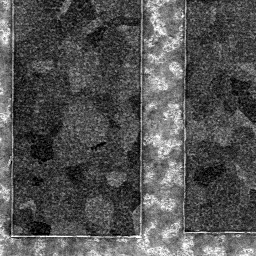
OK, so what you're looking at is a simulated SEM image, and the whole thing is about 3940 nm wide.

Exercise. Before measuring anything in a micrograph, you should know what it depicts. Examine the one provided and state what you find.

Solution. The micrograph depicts one or a few lines or trenches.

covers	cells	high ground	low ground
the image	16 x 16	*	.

.********...****
.********...****
.********...****
.********...****
.********...****
.********...****
.********...****
.********..*****
.********...****
.********...****
.********...****
.********...****
.********...****
.********..*****
.********...****
................